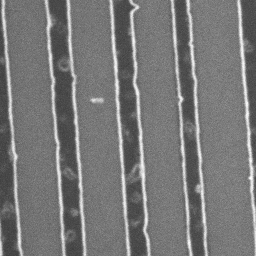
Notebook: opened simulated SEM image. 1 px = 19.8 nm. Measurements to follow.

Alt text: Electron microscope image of parallel lines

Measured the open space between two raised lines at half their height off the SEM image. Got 844 nanometers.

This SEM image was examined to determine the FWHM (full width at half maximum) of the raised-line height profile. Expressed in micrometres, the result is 0.412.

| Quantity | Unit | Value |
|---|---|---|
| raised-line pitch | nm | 1220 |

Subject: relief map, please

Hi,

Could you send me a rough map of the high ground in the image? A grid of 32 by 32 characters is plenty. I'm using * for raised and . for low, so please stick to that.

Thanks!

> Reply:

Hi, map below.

......***.....***.....**......**
......***.....***.....**......**
*.....***.....**......**......**
*.....***.....***.....**......**
*.....***.....***.....**......**
*.....***.....***.....**......**
*.....***.....***.....**......**
*.....***.....***.....**......**
*.....***.....***.....**......**
*.....***......**.....**......**
*......**......**.....**.......*
*......**......**.....**.......*
*......**......**......*.......*
*......**......**......**......*
*......**......**......**......*
*......***.....**......**......*
**.....***.....***.....**......*
**.....***.....***.....**......*
**.....***.....***.....**......*
**.....***.....***.....**......*
**.....***.....***.....**......*
**.....***.....***.....**......*
**.....***.....***.....**......*
**.....***......**.....**......*
**......**......**.....**.......
**......**......**.....**.......
**......**......**.....**.......
**......**......**......**......
**......**......**.....***......
**......***.....**......**......
**......***.....***.....**......
***.....***.....***.....**......